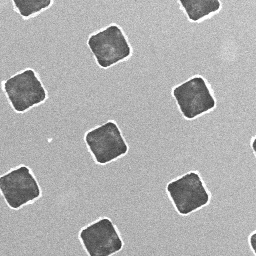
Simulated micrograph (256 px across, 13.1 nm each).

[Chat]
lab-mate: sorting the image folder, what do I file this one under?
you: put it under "holes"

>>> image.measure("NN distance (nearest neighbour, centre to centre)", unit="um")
1.26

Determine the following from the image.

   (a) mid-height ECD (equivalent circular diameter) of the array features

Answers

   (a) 0.502 micrometres